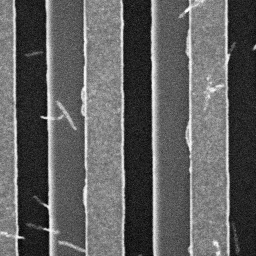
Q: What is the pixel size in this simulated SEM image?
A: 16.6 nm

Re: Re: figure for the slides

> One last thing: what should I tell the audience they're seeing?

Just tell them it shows lines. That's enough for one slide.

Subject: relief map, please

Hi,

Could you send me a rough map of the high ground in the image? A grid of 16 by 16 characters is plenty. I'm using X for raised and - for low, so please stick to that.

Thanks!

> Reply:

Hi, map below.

X--XXXXX--XXXX--
X--XXXXX--XXXX--
X--XXXXX--XXXX--
X--XXXXX--XXXX--
X--XXXXX--XXXX--
X--XXXXX--XXXX--
X--XXXXX--XXXX--
X--XXXXX--XXXX--
X--XXXXX--XXXX--
X--XXXXX--XXXX--
X--XXXXX--XXXX--
X--XXXXX--XXXX--
X--XXXXX--XXXX--
X--XXXXX--XXXX--
X--XXXXX--XXXX--
X--XXXXX--XXXX--